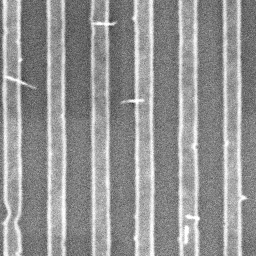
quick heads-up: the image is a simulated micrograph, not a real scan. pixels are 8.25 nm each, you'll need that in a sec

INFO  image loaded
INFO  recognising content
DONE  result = parallel lines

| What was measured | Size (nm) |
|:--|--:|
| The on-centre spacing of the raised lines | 363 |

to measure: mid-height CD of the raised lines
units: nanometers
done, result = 132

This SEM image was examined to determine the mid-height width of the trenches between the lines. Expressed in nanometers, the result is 231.